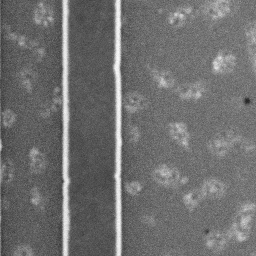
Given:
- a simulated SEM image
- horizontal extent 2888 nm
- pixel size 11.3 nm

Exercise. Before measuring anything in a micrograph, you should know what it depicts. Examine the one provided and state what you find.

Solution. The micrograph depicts one or a few lines or trenches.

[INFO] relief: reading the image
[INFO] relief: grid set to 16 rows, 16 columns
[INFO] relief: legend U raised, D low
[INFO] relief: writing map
DDDDUUUDDDDDDDDD
DDDDUUUDDDDDDDDD
DDDDUUUDDDDDDDDD
DDDDUUUDDDDDDDDD
DDDDUUUDDDDDDDDD
DDDDUUUDDDDDDDDD
DDDDUUUDDDDDDDDD
DDDDUUUDDDDDDDDD
DDDDUUUDDDDDDDDD
DDDDUUUDDDDDDDDD
DDDDUUUDDDDDDDDD
DDDDUUUDDDDDDDDD
DDDDUUUDDDDDDDDD
DDDDUUUDDDDDDDDD
DDDDUUUDDDDDDDDD
DDDDUUUDDDDDDDDD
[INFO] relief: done